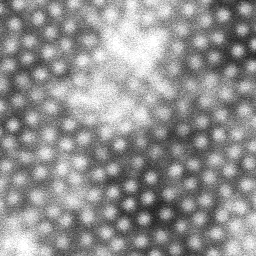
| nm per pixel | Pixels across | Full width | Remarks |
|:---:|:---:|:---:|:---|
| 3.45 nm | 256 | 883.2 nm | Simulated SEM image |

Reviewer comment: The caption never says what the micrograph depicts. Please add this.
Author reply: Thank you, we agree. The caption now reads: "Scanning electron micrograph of a regular array of raised bodies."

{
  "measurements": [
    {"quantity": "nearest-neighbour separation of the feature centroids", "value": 64.9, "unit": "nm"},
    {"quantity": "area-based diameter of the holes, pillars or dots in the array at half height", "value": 30.9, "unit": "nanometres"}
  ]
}